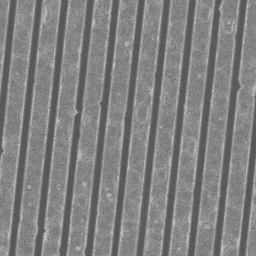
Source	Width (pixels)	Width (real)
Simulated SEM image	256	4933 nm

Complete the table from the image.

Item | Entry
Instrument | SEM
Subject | parallel lines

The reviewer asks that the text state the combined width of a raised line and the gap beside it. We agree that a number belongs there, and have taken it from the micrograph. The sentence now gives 0.489 um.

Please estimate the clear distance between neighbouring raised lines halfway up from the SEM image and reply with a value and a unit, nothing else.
129 nanometers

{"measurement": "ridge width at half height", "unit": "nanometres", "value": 359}